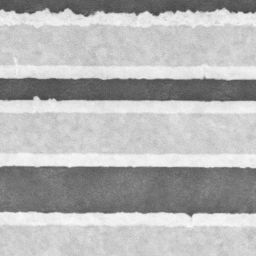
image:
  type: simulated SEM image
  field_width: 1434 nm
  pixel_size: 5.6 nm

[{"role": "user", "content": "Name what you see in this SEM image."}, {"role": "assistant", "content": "one or a few lines or trenches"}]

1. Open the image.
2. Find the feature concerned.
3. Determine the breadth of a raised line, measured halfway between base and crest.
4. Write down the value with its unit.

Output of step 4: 57.1 pixels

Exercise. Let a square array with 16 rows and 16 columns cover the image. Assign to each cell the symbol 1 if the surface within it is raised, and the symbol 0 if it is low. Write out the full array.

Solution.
0000000000000000
1111111111111111
1111111111111111
1111111111111111
1111111111111111
0000000000000000
0000000000000000
1111111111111111
1111111111111111
1111111111111111
0000000000000000
0000000000000000
0000000000000000
0000000000000000
1111111111111111
1111111111111111